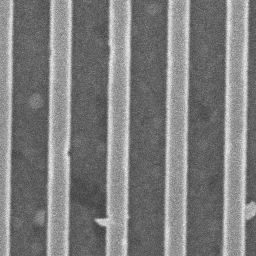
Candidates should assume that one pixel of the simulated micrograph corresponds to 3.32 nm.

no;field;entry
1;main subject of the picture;parallel lines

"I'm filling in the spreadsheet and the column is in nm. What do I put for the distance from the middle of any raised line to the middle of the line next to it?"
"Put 195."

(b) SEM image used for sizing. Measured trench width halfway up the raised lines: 129 nanometers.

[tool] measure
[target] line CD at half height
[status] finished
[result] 66 nanometers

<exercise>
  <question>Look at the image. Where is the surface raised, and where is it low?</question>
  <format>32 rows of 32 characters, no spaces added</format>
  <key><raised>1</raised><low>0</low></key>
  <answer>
11000011100000110000011100000110
10000011100000110000011100000110
10000011100000110000011100000110
10000011100000110000011100001110
10000011100000110000011100001110
10000011100000110000011100001110
10000011100000110000011000001110
10000011100000110000011000001110
10000011100000110000011000001110
10000011100000110000011000001110
10000011100000110000011000001110
10000011100000110000011000001110
10000011100000110000011000001110
10000011100000110000011000001110
10000011100000110000011000001110
10000011100000110000011000001110
10000011100000110000011000001110
10000011100000110000011000001110
10000011100000110000011000001110
10000011000000110000011000001110
10000011100001110000011000001110
10000011100001110000011000001110
10000011000000110000011000001110
10000011000000110000011000001110
10000011000000110000011000001110
10000011000000110000011000001110
10000011000000110000011000001110
10000011000011110000011000001100
10000011000001110000011000001100
10000011000001110000011000001100
10000011000001110000011000001100
10000011000001110000011000001100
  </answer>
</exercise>